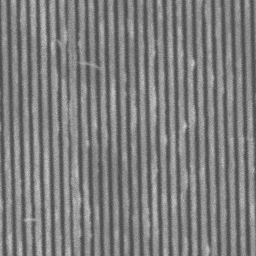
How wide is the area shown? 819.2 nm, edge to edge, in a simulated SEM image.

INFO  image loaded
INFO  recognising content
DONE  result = parallel lines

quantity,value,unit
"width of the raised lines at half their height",16.4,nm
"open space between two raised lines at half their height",5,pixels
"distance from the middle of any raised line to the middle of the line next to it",31.2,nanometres